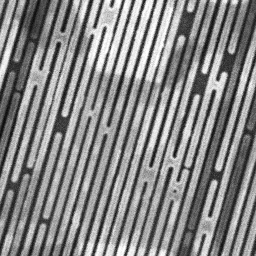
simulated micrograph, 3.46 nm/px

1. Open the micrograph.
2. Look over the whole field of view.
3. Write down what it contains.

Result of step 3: parallel lines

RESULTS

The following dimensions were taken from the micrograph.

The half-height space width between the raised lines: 15.8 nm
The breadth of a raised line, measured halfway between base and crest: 0.0191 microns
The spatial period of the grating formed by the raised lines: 35.1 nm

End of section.